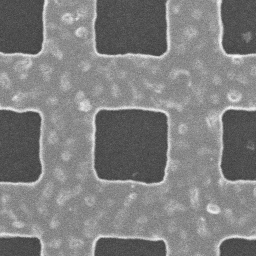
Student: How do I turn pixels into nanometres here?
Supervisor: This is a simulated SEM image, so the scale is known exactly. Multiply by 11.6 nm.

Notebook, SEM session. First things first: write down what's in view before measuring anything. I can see holes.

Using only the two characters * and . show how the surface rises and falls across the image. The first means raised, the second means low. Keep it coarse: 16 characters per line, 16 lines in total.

...***....****..
...***....****..
...***....****..
*********.******
****************
****************
****************
...***....****..
...***.....***..
..****....****..
...***....****..
****************
****************
****************
****************
...***....****..